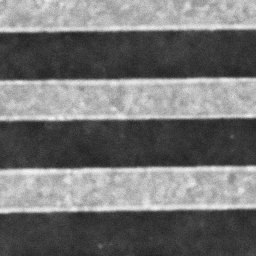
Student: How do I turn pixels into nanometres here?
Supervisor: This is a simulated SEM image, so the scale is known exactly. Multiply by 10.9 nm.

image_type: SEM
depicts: lines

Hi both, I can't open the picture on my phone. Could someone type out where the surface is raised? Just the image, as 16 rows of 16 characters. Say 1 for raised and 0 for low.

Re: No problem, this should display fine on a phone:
1111111111111111
1111111111111111
0000000000000000
0000000000000000
0000000000000000
1111111111111111
1111111111111111
0000000000000000
0000000000000000
0000000000000000
0000000001111111
1111111111111111
1111111111111111
0000000000000000
0000000000000000
0000000000000000